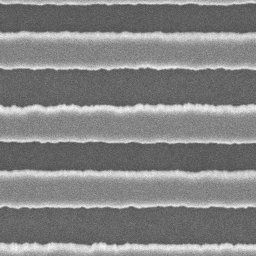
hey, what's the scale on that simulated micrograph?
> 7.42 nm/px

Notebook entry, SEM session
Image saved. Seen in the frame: lines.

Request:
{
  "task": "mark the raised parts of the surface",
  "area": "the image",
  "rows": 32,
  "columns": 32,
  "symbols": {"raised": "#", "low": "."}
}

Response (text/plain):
....##.#.###.#..#.......#####...
................................
................................
................................
################################
################################
################################
################################
################################
................................
................................
................................
................................
################################
################################
################################
################################
################################
................................
................................
................................
################..#####...###.##
################################
################################
################################
################################
................................
................................
................................
................................
#..##.###...#...............#...
################################